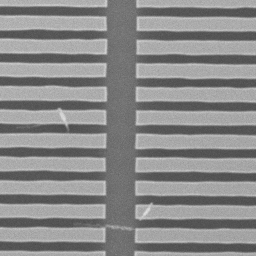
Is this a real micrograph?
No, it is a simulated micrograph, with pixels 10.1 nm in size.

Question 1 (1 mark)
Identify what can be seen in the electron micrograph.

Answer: groups of lines, slits or small figures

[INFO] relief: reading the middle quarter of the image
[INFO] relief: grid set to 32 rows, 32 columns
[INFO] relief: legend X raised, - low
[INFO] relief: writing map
XXXXXXXXXX--------XXXXXXXXXXXXXX
XXXXXXXXXX--------XXXXXXXXXXXXXX
XXXXXXXXXX--------XXXXXXXXXXXXXX
-----------------------XXX---XXX
--------------------------------
--------------------------------
XXXXXXXXXX--------XXXXXXXXXXXXXX
XXXXXXXXXX--------XXXXXXXXXXXXXX
XXXXXXXXXX--------XXXXXXXXXXXXXX
--------------------------------
--------------------------------
--------------------------------
XXXXXXXXXX--------XXXXXXXXXXXXXX
XXXXXXXXXX--------XXXXXXXXXXXXXX
XXXXXXXXXX--------XXXXXXXXXXXXXX
--------------------------------
--------------------------------
XXXXX---XX--------XXX-----------
XXXXXXXXXX--------XXXXXXXXXXXXXX
XXXXXXXXXX--------XXXXXXXXXXXXXX
XXXXXXXXXX--------XXXXXXXXXXXXXX
--------------------------------
--------------------------------
XXXXXXXX------------XX---XXXXX--
XXXXXXXXXX--------XXXXXXXXXXXXXX
XXXXXXXXXX--------XXXXXXXXXXXXXX
XXXXXXXXXX--------XXXXXXXXXXXXXX
--------------------------------
--------------------------------
XXXXXXXXXX--------XXXX----------
XXXXXXXXXX--------XXXXXXXXXXXXXX
XXXXXXXXXX--------XXXXXXXXXXXXXX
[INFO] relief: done